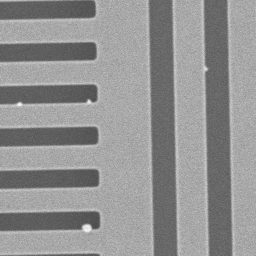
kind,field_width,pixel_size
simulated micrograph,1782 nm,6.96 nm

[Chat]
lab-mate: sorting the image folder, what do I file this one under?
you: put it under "groups of lines, slits or small figures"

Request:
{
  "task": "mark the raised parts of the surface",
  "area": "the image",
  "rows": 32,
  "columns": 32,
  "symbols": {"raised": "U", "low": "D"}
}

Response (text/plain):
DDDDDDDDDDDDUUUUUUDDDDUUUDDDDUUU
DDDDDDDDDDDDUUUUUUUDDDUUUDDDDUUU
DDDUUUUUUUUUUUUUUUUDDDUUUDDDDUUU
UUUUUUUUUUUUUUUUUUUDDDUUUDDDDUUU
UUUUUUUUUUUUUUUUUUUDDDUUUDDDDUUU
DDDDDDDDDDDDUUUUUUUDDDUUUUDDDUUU
DDDDDDDDDDDDUUUUUUUDDDUUUUDDDUUU
DDDDDDDDDDDUUUUUUUUDDDUUUUDDDUUU
UUUUUUUUUUUUUUUUUUUDDDUUUUDDDUUU
UUUUUUUUUUUUUUUUUUUDDDUUUUDDDUUU
UUUUUUUUUDDUUUUUUUUDDDUUUUDDDUUU
DDDDDDDDDDDDUUUUUUUDDDUUUUDDDUUU
DDDDDDDDDDDDUUUUUUUDDDUUUUDDDUUU
UUUUUUUUUUUUUUUUUUUDDDUUUUDDDUUU
UUUUUUUUUUUUUUUUUUUDDDUUUUDDDUUU
UUUUUUUUUUUUUUUUUUUDDDUUUUDDDUUU
DDDDDDDDDDDDUUUUUUUDDDUUUUDDDUUU
DDDDDDDDDDDDUUUUUUUDDDUUUUDDDUUU
UUUUUUUUUUUUUUUUUUUDDDUUUUDDDUUU
UUUUUUUUUUUUUUUUUUUDDDUUUUDDDUUU
UUUUUUUUUUUUUUUUUUUDDDUUUUDDDUUU
DDDDDDDDDDDDUUUUUUUDDDUUUUDDDUUU
DDDDDDDDDDDDUUUUUUUDDDUUUUDDDUUU
DDDDDDDDDDDUUUUUUUUDDDUUUUDDDUUU
UUUUUUUUUUUUUUUUUUUDDDUUUUDDDUUU
UUUUUUUUUUUUUUUUUUUDDDUUUUDDDUUU
UUUUDDDDDDDDUUUUUUUDDDUUUUDDDUUU
DDDDDDDDDDDDDUUUUUUDDDUUUUDDDUUU
DDDDDDDDDDUUUUUUUUUDDDUUUUDDDUUU
UUUUUUUUUUUUUUUUUUUDDDUUUUDDDUUU
UUUUUUUUUUUUUUUUUUUDDDUUUUDDDUUU
UUUUUUUUUUUUUUUUUUUDDDUUUUDDDUUU